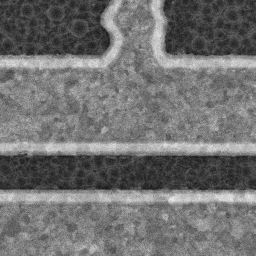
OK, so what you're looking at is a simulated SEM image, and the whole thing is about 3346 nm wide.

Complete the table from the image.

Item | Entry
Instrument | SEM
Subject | one or a few lines or trenches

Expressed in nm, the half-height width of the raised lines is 1100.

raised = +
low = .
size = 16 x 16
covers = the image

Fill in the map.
.......+++......
.......+++......
.......+++......
.......+++......
++++++++++++++++
++++++++++++++++
++++++++++++++++
++++++++++++++++
++++++++++++++++
................
................
................
++++++++++++++++
++++++++++++++++
++++++++++++++++
++++++++++++++++